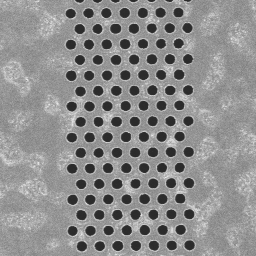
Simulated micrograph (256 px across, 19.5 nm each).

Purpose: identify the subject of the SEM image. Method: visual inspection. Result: a regular array of holes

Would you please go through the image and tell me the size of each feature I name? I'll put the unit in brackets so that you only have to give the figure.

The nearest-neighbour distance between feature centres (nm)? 343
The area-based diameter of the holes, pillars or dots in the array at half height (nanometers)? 198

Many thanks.